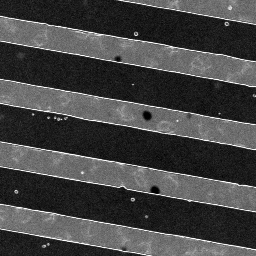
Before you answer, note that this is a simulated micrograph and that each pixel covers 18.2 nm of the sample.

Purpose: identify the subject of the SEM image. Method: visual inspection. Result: one or a few lines or trenches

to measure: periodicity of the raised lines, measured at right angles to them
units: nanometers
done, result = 1120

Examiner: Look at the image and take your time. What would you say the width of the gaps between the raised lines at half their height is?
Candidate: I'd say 24.1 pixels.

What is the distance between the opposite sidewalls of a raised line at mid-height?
684 nanometres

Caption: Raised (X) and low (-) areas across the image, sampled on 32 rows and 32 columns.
XXXXXXXXXXXXXXXXXX--------------
XXXXXXXXXXXXXXXXXXXXXXX---------
--XXXXXXXXXXXXXXXXXXXXXXXXXXX---
--------XXXXXXXXXXXXXXXXXXXXXXXX
--------------XXXXXXXXXXXXXXXXXX
XX------------------XXXXXXXXXXXX
XXXXXXXX-----------------XXXXXXX
XXXXXXXXXXXXX-----------------XX
XXXXXXXXXXXXXXXXXXX-------------
XXXXXXXXXXXXXXXXXXXXXXXXX-------
---XXXXXXXXXXXXXXXXXXXXXXXXXXX--
---------XXXXXXXXXXXXXXXXXXXXXXX
--------------XXXXXXXXXXXXXXXXXX
XXX-----------------XXXXXXXXXXXX
XXXXXXXXX-----------------XXXXXX
XXXXXXXXXXXXXX------X----------X
XXXXXXXXXXXXXXXXXXXXX-----------
XXXXXXXXXXXXXXXXXXXXXXXXX-------
----XXXXXXXXXXXXXXXXXXXXXXXXXXX-
----------XXXXXXXXXXXXXXXXXXXXXX
----------------XXXXXXXXXXXXXXXX
XXXX-----------------XXXXXXXXXXX
XXXXXXXXX--------X---------XXXXX
XXXXXXXXXXXXXXXX----------------
XXXXXXXXXXXXXXXXXXXXX-----------
XXXXXXXXXXXXXXXXXXXXXXXXXXX-----
-----XXXXXXXXXXXXXXXXXXXXXXXXXXX
-----------XXXXXXXXXXXXXXXXXXXXX
----------------XXXXXXXXXXXXXXXX
XXXXX-----------------XXXXXXXXXX
XXXXXXXXXXX-----------------XXXX
XXXXXXXXXXXXXXXX----------------